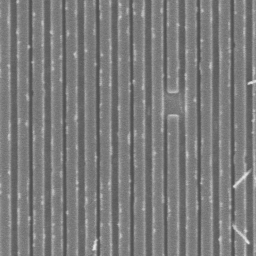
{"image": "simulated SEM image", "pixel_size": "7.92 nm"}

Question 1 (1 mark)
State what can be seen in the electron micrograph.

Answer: parallel lines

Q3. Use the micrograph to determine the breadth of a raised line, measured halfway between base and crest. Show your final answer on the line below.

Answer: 87.1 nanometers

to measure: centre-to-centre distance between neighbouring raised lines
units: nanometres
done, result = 132